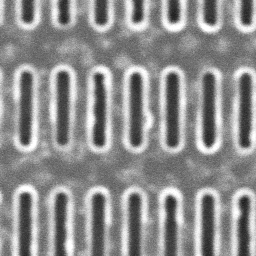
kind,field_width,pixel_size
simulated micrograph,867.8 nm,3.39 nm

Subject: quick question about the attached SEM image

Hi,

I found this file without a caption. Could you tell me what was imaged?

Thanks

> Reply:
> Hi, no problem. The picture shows holes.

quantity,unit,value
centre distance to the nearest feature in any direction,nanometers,123